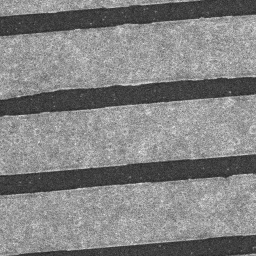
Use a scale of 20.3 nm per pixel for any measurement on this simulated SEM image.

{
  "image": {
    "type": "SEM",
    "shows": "one or a few lines or trenches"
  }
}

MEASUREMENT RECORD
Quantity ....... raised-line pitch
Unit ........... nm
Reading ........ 1620